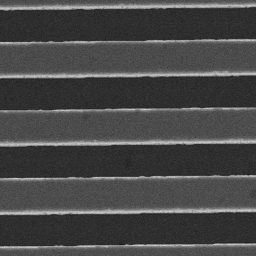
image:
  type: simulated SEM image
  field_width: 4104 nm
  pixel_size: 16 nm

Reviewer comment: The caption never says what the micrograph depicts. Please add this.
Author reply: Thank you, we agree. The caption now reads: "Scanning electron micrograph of lines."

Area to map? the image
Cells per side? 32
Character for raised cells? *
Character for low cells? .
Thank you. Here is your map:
********************************
................................
................................
................................
................................
********************************
********************************
********************************
********************************
******************..............
................................
................................
................................
................................
********************************
********************************
********************************
********************************
................................
................................
................................
................................
********************************
********************************
********************************
********************************
***************************.....
................................
................................
................................
................................
********************************